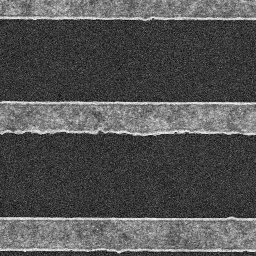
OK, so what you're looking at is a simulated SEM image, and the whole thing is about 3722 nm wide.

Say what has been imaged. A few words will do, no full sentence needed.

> one or a few lines or trenches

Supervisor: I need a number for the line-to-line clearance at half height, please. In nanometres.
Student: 1240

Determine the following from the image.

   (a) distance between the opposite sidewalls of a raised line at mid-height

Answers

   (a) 445 nm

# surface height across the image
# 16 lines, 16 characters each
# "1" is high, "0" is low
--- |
1111111111111111
0000000000000000
0000000000000000
0000000000000000
0000000000000000
0000000000000000
1111111111111111
1111111111111111
0000000000000000
0000000000000000
0000000000000000
0000000000000000
0000000000000000
0000000000000000
1111111111111111
1111111111111111